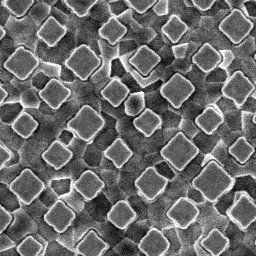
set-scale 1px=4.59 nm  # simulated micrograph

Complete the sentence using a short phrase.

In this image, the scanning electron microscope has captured a regular array of raised bodies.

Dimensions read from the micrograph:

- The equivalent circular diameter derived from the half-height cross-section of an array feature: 118 nm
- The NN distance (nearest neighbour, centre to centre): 125 nm